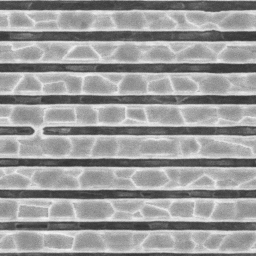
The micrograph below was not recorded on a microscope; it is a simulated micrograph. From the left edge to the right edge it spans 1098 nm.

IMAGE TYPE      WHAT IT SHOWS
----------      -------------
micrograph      parallel lines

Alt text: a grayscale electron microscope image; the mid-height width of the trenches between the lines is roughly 45.1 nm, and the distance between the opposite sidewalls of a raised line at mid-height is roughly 90.2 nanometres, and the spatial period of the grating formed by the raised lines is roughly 0.136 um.